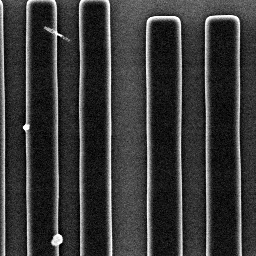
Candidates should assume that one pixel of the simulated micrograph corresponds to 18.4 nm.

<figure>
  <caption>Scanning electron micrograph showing groups of lines, slits or small figures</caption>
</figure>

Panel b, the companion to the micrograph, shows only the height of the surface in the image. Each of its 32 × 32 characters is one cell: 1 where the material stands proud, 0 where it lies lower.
00011110001111000000000000000000
00011110001111000000000000000000
00011110001111000001110000111100
00011110001111000011111000111100
00011110001111000011111000111100
00011110001111000011111000111100
00011110001111000011111000111100
00011110001111000011111000111100
00011110001111000011111000111100
00011110001111000011111000111100
00011110001111000011111000111100
00011110001111000011111000111100
10011110001111000011111000111100
10011110001111000011111000111100
10011110001111000011111000111100
10011110001111000011111000111100
10011110001111000011111000111100
10011110001111000011111000111100
10011110001111000001111000111100
10011110001111000001111000111100
10011110001111000001111000111100
10011110001111000001111000111100
10011110001111000001111000111100
10011110001111000001111000111100
10011110001111000011111000111100
10011110001111000011111000111100
10011110001111000011111000111100
10011110001111000011111000111100
10011110001111000001111000111100
10011111001111000001111000111100
10011111001111000001111000111100
10011110001111000001111000111100